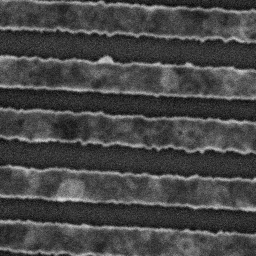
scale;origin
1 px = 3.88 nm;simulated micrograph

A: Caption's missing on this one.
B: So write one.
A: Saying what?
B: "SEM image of lines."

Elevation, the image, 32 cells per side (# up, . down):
#############.#.................
################################
################################
################################
...................#############
................................
................................
#######.##...#..................
#############################...
################################
################################
.............###################
................................
................................
###############.##..............
################################
################################
...#############################
..................#...##########
................................
................................
###########.....................
################################
################################
################################
..................##############
................................
................................
#################...............
################################
################################
...#############################